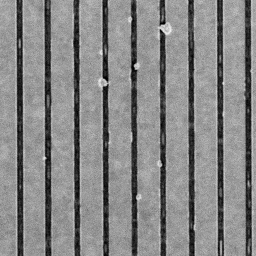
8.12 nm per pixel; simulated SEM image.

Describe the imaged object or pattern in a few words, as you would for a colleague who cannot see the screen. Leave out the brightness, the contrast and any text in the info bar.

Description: parallel lines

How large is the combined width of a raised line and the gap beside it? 232 nm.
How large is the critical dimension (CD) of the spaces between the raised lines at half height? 56.8 nm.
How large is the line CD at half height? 176 nanometres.